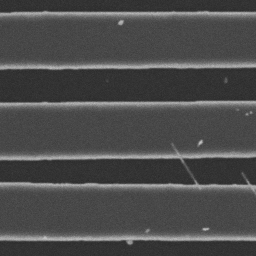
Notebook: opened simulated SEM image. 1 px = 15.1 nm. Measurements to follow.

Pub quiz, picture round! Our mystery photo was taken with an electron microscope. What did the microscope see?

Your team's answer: lines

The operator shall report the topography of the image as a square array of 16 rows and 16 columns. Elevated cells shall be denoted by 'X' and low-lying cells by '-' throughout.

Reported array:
----------------
XXXXXXXXXXXXXXXX
XXXXXXXXXXXXXXXX
XXXXXXXXXXXXXXXX
----------------
----------------
XXXXXXXXXXXXXXXX
XXXXXXXXXXXXXXXX
XXXXXXXXXXXXXXXX
XXXXXXXXXXXXXXXX
----------------
XXX-------------
XXXXXXXXXXXXXXXX
XXXXXXXXXXXXXXXX
XXXXXXXXXXXXXXXX
----------------